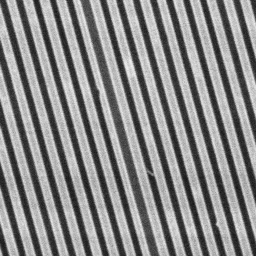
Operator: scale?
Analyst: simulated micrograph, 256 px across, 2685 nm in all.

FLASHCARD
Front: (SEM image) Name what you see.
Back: parallel lines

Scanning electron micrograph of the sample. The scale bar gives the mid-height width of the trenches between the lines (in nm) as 70.8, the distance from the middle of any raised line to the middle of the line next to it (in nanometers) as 169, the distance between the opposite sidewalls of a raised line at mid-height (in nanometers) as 91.